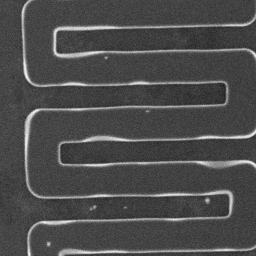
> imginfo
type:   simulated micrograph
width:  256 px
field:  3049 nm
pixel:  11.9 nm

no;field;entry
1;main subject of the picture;groups of lines, slits or small figures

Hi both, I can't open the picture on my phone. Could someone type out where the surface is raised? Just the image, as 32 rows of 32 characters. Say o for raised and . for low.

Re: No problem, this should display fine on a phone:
...ooooooooooooooooooooooooooooo
...ooooooooooooooooooooooooooooo
...ooooooooooooooooooooooooooooo
...oooooooooo.ooo...............
...oooo.........................
...oooo.........................
...oooo.....oooooooooooooooooooo
...ooooooooooooooooooooooooooooo
...ooooooooooooooooooooooooooooo
...ooooooooooooooooooooooooooooo
....ooooo.oooooo............oooo
............................oooo
............................oooo
.............ooooooooooooooooooo
....oooooooooooooooooooooooooooo
...ooooooooooooooooooooooooooooo
...ooooooooooooooooooooooooooooo
...oooooooo....oooo.............
...oooo.........................
...oooo.........................
...ooooo......ooooooooooooo.oooo
...ooooooooooooooooooooooooooooo
...ooooooooooooooooooooooooooooo
....oooooooooooooooooooooooooooo
.....ooooooo.oo..............ooo
.............................ooo
.............................ooo
................oooooooooooooooo
....oooooooooooooooooooooooooooo
....oooooooooooooooooooooooooooo
....oooooooooooooooooooooooooooo
....oooooooooooooooo............